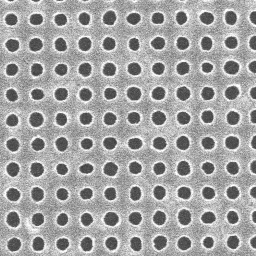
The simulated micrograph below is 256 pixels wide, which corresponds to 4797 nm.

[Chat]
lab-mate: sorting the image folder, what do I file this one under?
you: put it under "a regular array of holes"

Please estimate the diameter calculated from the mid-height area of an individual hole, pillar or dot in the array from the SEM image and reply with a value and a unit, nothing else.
251 nanometres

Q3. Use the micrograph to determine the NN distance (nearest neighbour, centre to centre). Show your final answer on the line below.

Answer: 451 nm